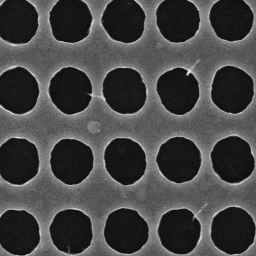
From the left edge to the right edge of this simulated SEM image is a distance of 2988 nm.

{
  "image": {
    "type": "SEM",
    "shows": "a regular array of holes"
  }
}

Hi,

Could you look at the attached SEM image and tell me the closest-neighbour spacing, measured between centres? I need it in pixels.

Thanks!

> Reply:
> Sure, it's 53.6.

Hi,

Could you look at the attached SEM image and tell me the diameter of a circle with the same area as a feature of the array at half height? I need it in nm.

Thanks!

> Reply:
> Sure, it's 526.